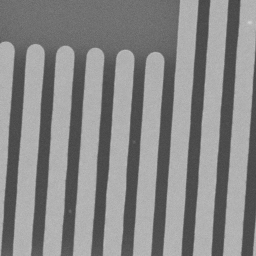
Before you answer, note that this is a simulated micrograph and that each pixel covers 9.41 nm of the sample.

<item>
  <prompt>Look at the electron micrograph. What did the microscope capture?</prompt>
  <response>groups of lines, slits or small figures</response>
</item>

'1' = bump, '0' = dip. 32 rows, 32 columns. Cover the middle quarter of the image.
11000111110001111000011110001111
11000111110001111000111110001111
11000111110001111000111110001111
11000111110001111000111110001111
11000111100001111000111110001111
11000111100001111000111110001111
11000111100001111000111110001111
11000111100011111000111100001111
11000111100011111000111100001111
11000111100011111000111100001111
11000111100011111000111100011111
11000111100011111000111100011111
11000111100011111000111100011111
11000111100011110000111100011111
10000111100011110000111100011111
10000111100011110000111100011111
10000111100011110001111100011110
10000111100011110001111100011110
10001111100011110001111100011110
10001111000011110001111100011110
10001111000011110001111100011110
10001111000011110001111000011110
10001111000111110001111000011110
10001111000111110001111000011110
10001111000111110001111000011110
10001111000111110001111000111110
10001111000111110001111000111110
10001111000111100001111000111110
00001111000111100001111000111110
00001111000111100001111000111110
00001111000111100011111000111100
00001111000111100011111000111100